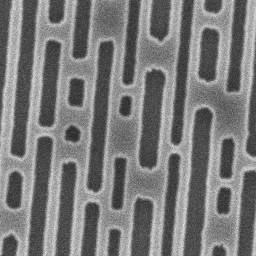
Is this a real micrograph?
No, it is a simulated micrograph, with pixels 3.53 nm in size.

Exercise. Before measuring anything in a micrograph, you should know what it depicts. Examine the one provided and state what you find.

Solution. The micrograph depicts parallel lines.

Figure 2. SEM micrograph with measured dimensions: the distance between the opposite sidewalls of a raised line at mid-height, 34.7 nanometers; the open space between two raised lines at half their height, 16.1 px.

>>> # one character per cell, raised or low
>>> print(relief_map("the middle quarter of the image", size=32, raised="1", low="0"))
11111111000011100011111111110001
11111111000011000011110011110001
11111111000011000011000001110001
11010111000011000011000000110001
10000111000011000011000000110001
10000111000011111111000001110001
10000111000011111111000001110001
10000110000111111111000001100001
10000110000111000111000001100001
10000110000011000110000001100011
10000110000111000110000001100001
11111110000111000110000001100011
11111110000111000110000001100011
11111110000111111110000011100011
11111110000111111110000001100011
10011110000111111110000011100011
00001100000111111110000011000011
00001110000111111110000011100011
00001110000111111110000011100011
10011100000111111110000011100111
11111100000111111110000011110111
11111100001111111110000011111111
11111100001111111100000011100111
11111100001110001100000011000110
10011100001100001110000011000111
00011100001100001110000111000111
00011100001100001111101111000110
00011100001100001111111111000110
00011100001100001111111111000110
00011000001100011111111111000110
00011000001100011111111110000110
00011100011100011111111110000110